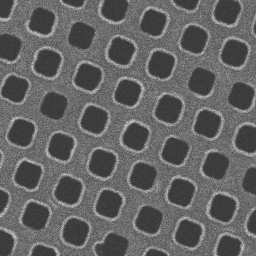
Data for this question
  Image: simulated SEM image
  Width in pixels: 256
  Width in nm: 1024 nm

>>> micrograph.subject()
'a regular array of holes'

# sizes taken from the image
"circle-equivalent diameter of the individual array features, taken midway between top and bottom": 105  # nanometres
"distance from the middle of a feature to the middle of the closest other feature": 167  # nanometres